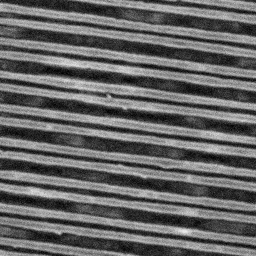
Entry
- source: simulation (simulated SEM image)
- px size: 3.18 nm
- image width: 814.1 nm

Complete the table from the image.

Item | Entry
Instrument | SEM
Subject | parallel lines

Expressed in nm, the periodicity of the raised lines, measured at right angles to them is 52.4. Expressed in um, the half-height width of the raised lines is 0.022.